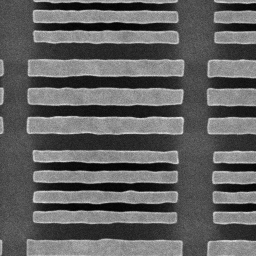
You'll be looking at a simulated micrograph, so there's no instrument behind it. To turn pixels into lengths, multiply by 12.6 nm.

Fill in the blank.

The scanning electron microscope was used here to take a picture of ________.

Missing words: groups of lines, slits or small figures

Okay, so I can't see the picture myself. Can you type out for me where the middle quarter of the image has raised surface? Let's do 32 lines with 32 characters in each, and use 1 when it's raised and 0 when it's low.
11111111111111111111111111111100
11111111111111111111111111111100
11111111111111111111111111111100
00000000000000000000000000000000
00000000000000000000000000000000
00000000000000000000000000000000
11111111111111111111111111100000
11111111111111111111111111111100
11111111111111111111111111111100
11111111111111111111111111111000
00000000000000000000000000000000
00000000000000000000000000000000
00000000000000000000000000000000
11111111111111111100111111111100
11111111111111111111111111111100
11111111111111111111111111111100
11111111111111111111111111111100
00000000110011000000000000000000
00000000000000000000000000000000
00000000000000000000000000000000
00000000000000000000000000000000
00000000000000000000000000000000
11111111111111111111111111110000
11111111111111111111111111110000
00000111111110001111111000110000
00000000000000000000000000000000
00000000000000000000000000000000
11111111111111111111111111110000
11111111111111111111111111110000
11111111111111111111111111110000
00000000000000000000000000000000
00000000000000000000000000000000